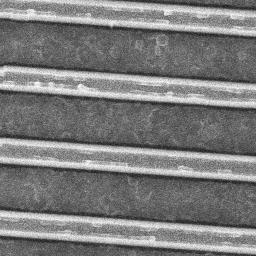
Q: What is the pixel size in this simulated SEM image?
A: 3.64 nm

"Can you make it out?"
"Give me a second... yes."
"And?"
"one or a few lines or trenches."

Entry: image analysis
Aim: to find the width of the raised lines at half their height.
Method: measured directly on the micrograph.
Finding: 73.6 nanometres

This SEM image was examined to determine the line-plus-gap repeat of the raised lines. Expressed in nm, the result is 264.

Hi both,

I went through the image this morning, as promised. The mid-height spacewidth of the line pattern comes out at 190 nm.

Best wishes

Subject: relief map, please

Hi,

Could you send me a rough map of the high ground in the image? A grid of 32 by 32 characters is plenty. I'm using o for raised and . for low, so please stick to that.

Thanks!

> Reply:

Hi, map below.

ooooooooooooooo.................
oooooooooooooooooooooooooooo....
........oooooooooooooooooooooooo
......................oooooooooo
................................
................................
................................
................................
................................
oooooooooooooo..................
ooooooooooooooooooooooooooo.....
.......ooooooooooooooooooooooooo
.....................ooooooooooo
................................
................................
................................
................................
................................
ooooooooooooo...................
oooooooooooooooooooooooooo......
......oooooooooooooooooooooooooo
....................oooooooooooo
................................
................................
................................
................................
................................
oooooooooooo....................
ooooooooooooooooooooooooo.......
.....ooooooooooooooooooooooooooo
...................ooooooooooooo
................................